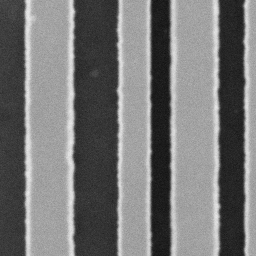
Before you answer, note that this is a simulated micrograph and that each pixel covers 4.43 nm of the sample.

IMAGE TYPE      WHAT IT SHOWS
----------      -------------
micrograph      lines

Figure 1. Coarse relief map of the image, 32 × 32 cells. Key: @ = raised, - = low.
---@@@@@@------@@@@--@@@@@@----@
---@@@@@@------@@@@--@@@@@@----@
---@@@@@@------@@@@--@@@@@@----@
---@@@@@@------@@@@--@@@@@@----@
---@@@@@@------@@@@--@@@@@@----@
---@@@@@@------@@@@--@@@@@@---@@
---@@@@@@------@@@@--@@@@@@----@
---@@@@@@------@@@@--@@@@@@----@
---@@@@@@------@@@@--@@@@@@----@
---@@@@@@------@@@@--@@@@@@----@
---@@@@@@------@@@@--@@@@@@----@
---@@@@@@------@@@@--@@@@@@----@
---@@@@@@------@@@@--@@@@@@----@
---@@@@@@------@@@@--@@@@@@----@
---@@@@@@------@@@@--@@@@@@----@
---@@@@@@------@@@@--@@@@@@----@
---@@@@@@------@@@@--@@@@@@----@
---@@@@@@------@@@@--@@@@@@----@
---@@@@@@------@@@@--@@@@@@----@
---@@@@@@------@@@@--@@@@@@----@
---@@@@@@------@@@@--@@@@@@----@
---@@@@@@------@@@@--@@@@@@----@
---@@@@@@------@@@@--@@@@@@----@
---@@@@@@------@@@@--@@@@@@----@
---@@@@@@------@@@@--@@@@@@----@
---@@@@@@------@@@@--@@@@@@----@
---@@@@@@------@@@@--@@@@@@----@
---@@@@@@------@@@@--@@@@@@----@
---@@@@@@------@@@@--@@@@@@----@
---@@@@@@------@@@@--@@@@@@----@
---@@@@@@------@@@@--@@@@@@----@
---@@@@@@------@@@@--@@@@@@----@